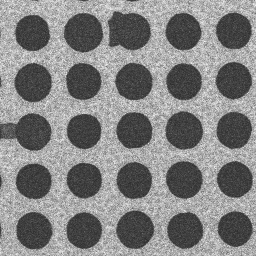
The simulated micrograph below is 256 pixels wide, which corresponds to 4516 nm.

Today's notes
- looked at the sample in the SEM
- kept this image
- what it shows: a regular array of holes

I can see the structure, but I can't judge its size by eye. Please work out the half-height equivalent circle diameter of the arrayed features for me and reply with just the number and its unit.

643 nanometres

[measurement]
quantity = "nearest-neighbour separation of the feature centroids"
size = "49.2 pixels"